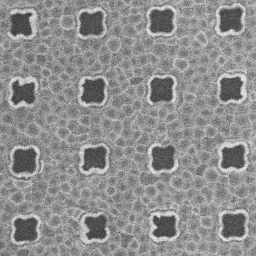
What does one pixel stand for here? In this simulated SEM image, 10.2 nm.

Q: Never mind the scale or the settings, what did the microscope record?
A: a regular array of holes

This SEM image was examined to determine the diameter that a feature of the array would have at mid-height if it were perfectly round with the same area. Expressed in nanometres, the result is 263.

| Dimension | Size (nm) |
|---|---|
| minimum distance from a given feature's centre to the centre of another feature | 696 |